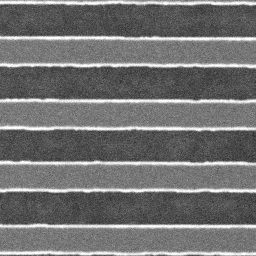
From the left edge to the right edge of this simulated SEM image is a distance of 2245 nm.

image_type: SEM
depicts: lines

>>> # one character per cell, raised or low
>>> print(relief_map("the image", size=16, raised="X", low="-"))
----------------
----------------
XXXXXXXXXXXXXXXX
XXXXXXXXXXXXXXXX
----------------
----------------
XXXXXXXXXXXXXXXX
XXXXXXXXXXXXXXXX
----------------
----------------
XXXXXXXXXXXXXXXX
XXXXXXXXXXXXXXXX
----------------
----------------
XXXXXXXXXXXXXXXX
XXXXXXXXXXXXXXXX